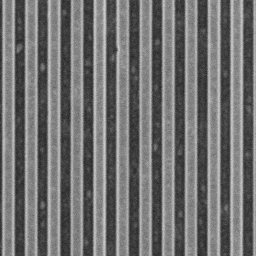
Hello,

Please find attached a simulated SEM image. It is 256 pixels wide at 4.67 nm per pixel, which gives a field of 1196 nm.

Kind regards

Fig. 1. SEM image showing parallel lines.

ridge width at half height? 50.2 nm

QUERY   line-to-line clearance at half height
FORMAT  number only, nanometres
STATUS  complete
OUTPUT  54.9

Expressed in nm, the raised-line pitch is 107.